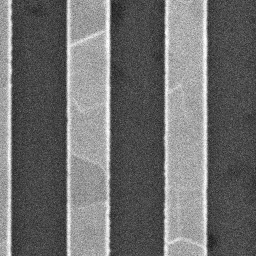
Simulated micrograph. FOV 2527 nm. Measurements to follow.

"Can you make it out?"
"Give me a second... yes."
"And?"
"lines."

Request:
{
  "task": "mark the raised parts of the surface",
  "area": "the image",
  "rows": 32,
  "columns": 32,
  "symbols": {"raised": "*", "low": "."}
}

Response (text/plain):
*.......******.......*****......
*.......******.......*****......
*.......******.......*****......
*.......******.......*****......
*.......******.......*****......
*.......******.......*****......
*.......******.......*****......
*.......******.......*****......
*.......******.......*****......
*.......******.......*****......
*.......******.......*****......
*.......******.......*****......
*.......******.......*****......
*.......******.......*****......
*.......******.......*****......
*.......******.......*****......
*.......******.......*****......
*.......******.......*****......
*.......******.......*****......
*.......******.......*****......
*.......******.......*****......
*.......******.......*****......
*.......******.......*****......
*.......******.......*****......
*.......******.......*****......
*.......******.......*****......
*.......******.......*****......
*.......******.......*****......
*.......******.......*****......
*.......******.......*****......
*.......******.......*****......
*.......******.......*****......